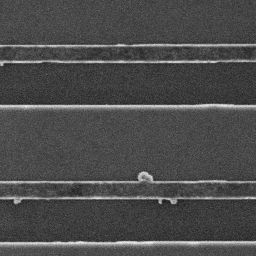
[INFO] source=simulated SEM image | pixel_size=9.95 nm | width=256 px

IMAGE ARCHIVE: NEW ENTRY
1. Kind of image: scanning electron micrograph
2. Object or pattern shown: lines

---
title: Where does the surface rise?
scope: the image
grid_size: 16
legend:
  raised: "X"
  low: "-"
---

XXXXXXXXXXXXXXXX
XXXXXXXXXXXXXXXX
XXXXXXXXXXXXXXXX
XXXXXXXXXXXXXXXX
----------------
----------------
----------------
XXXXXXXXXXXXXXXX
XXXXXXXXXXXXXXXX
XXXXXXXXXXXXXXXX
XXXXXXXXXXXXXXXX
XXXXXXXXXXXXXXXX
-X--------X-----
----------------
----------------
XXXXXXXXXXXXXXXX